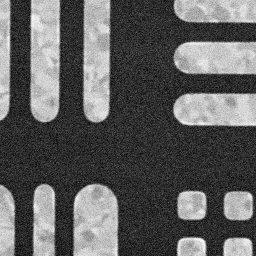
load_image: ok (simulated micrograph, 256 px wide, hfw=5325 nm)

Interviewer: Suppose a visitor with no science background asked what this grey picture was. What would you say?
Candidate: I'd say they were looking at groups of lines, slits or small figures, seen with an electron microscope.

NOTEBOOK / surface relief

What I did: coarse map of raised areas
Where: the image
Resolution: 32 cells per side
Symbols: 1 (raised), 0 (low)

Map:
10001110000111000000001111111111
10001110000111000000001111111111
10001110000111000000000111111111
10001110000111000000000000000000
10001110000111000000000000000000
10001110000111000000000111111111
10001110000111000000001111111111
10001110000111000000001111111111
10001110000111000000001111111111
10001110000111000000000000000000
10001110000111000000000000000000
10001110000111000000000000000000
10001110000111000000001111111111
10001110000111000000001111111111
10001110000110000000001111111111
00000000000000000000000011111111
00000000000000000000000000000000
00000000000000000000000000000000
00000000000000000000000000000000
00000000000000000000000000000000
00000000000000000000000000000000
00000000000000000000000000000000
00000000000000000000000000000000
10000100000110000000000000000000
10001110001111000000001110001110
11001110011111100000001111001110
11001110011111100000001111001110
11001110011111100000000000000000
11001110011111100000000000000000
11001110011111100000000000000000
11001110011111100000001111001110
11001110011111100000001111001110